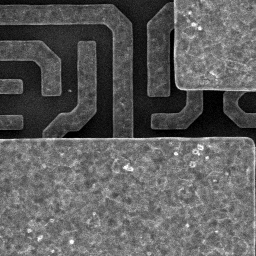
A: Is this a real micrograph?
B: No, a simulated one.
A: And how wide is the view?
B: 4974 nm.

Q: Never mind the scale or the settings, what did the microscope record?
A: wiring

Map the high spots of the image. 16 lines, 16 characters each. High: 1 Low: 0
0000000000011111
0000000000011111
0000000000011111
0000000000011111
0000000000011111
0000000000011111
0000000000000000
0000000000000000
0000000000000000
1111111111111111
1111111111111111
1111111111111111
1111111111111111
1111111111111111
1111111111111111
1111111111111111